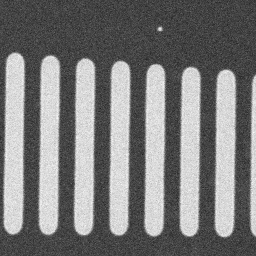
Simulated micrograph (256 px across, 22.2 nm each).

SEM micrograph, groups of lines, slits or small figures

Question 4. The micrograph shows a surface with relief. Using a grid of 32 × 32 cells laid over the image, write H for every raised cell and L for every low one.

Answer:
HHHHHHHHHHHHHHHHHHHHHHHHHHHHHHHH
HHHHHHHHHHHHHHHHHHHHHHHHHHHHHHHH
HHHHHHHHHHHHHHHHHHHHHHHHHHHHHHHH
HHHHHHHHHHHHHHHHHHHHHHHHHHHHHHHH
HHHHHHHHHHHHHHHHHHHHHHHHHHHHHHHH
HHHHHHHHHHHHHHHHHHHHHHHHHHHHHHHH
HHHHHHHHHHHHHHHHHHHHHHHHHHHHHHHH
HLLHHHLHHHHHHHHHHHHHHHHHHHHHHHHH
HLLHHLLHHHLLHHLLHHHLHHHHHHHHHHHH
HLLHHLLHHHLLHHLLHHHLHHHLLHHLLHHH
HLLHHLLHHHLLHHLLHHLLHHHLLHHLLHHH
HLLHHLLHHHLLHHLLHHLLHHHLLHHLLHHH
HLLHHLLHHHLLHHLLHHLLHHHLLHHLLHHH
HLLHHLLHHHLLHHLLHHLLHHHLLHHLLHHH
HLLHHLLHHHLLHHLLHHLLHHHLLHHLLHHH
HLLHHLLHHHLLHHLLHHLLHHHLLHHLLHHH
HLLHHLLHHHLLHHLLHHLLHHHLLHHLLHHH
HLLHHLLHHHLLHHLLHHLLHHHLLHHLLHHH
HLLHHLLHHHLLHHLLHHLLHHHLLHHLLHHL
HLLHHLLHHHLLHHLLHHLLHHHLLHHLLHHL
HLLHHLLHHLLLHHLLHHLLHHHLLHHLLHHL
HLLHHLLHHLLLHHLLHHLLHHHLLHHLLHHL
HLLHHLLHHLLLHHLLHHLLHHHLLHHLLHHL
HLLHHLLHHLLLHHLLHHLLHHHLLHHLLHHL
HLLHHLLHHLLLHHLLHHLLHHHLLHHLLHHL
HLLHHLLHHLLLHHLLHHLLHHHLLHHLLHHL
HLLHHLLHHLLLHHLLHHLLHHHLLHHLLHHL
HLLHHLLHHLLLHHLLHHLLHHHLLHHLLHHL
HLHHHLLHHHLHHHLLHHLLHHHLLHHLLHHH
HHHHHHHHHHHHHHHHHHHHHHHHHHHHHHHH
HHHHHHHHHHHHHHHHHHHHHHHHHHHHHHHH
HHHHHHHHHHHHHHHHHHHHHHHHHHHHHHHH